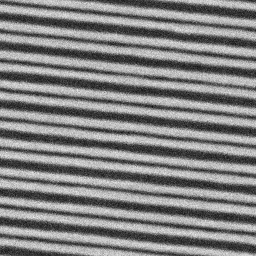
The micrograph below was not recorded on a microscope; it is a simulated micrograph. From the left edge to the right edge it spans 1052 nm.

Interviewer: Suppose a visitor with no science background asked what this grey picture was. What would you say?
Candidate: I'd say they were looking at parallel lines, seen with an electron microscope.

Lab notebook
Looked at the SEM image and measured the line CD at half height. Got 31.7 nanometers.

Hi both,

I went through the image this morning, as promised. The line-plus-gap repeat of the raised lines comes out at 59.5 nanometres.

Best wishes